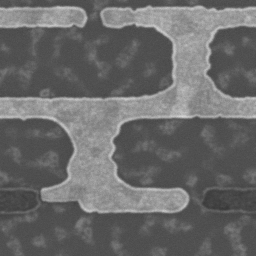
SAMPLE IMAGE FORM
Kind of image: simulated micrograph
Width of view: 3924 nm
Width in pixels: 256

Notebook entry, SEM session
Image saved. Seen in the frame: one or a few lines or trenches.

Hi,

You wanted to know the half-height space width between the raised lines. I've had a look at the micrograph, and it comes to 1100 nanometers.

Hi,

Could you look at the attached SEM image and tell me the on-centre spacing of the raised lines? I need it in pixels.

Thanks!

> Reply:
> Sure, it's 90.7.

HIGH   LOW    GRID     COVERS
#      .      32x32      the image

................................
##########...###################
###########..###################
...................########.....
.....................######.....
......................####......
......................####......
......................####......
......................####......
......................####......
......................#####.....
....................########....
################################
################################
########################.##.####
........#######.................
........#######.................
.........#####..................
.........#####..................
.........#####..................
.........#####..................
.........#####..................
........#######.................
......##########..........##....
#######################..#######
#####.....#############..#######
###..................#..........
................................
................................
................................
................................
................................